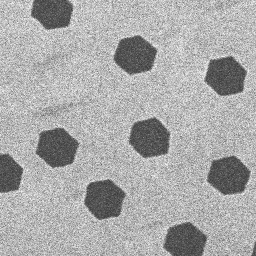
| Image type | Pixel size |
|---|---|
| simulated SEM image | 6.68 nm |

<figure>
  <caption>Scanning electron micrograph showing holes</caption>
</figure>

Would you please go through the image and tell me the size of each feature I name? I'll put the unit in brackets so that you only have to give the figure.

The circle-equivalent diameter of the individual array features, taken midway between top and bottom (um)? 0.267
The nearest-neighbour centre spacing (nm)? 537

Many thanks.